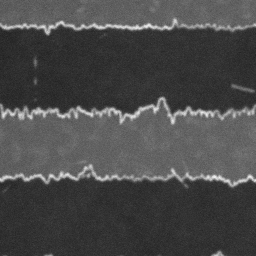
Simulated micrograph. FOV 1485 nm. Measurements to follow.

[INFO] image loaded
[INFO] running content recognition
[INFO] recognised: one or a few lines or trenches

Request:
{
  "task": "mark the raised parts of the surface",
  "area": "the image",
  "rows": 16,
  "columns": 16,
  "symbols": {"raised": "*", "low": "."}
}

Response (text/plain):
................
................
****************
****************
****************
****************
****************
................
................
................
................
****************
****************
****************
****************
****************